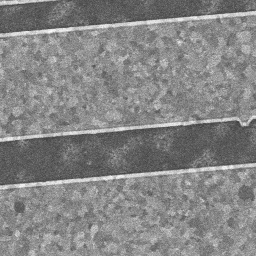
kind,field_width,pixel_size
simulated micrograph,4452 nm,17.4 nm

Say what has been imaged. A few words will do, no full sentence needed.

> one or a few lines or trenches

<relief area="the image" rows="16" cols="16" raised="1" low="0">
0000000000000000
0000000011111111
1111111111111111
1111111111111111
1111111111111111
1111111111111111
1111111111111111
1111111111111101
1100000000000000
0000000000000000
0000000000000011
0001111111111111
1111111111111111
1111111111111111
1111111111111111
1111111111111111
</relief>